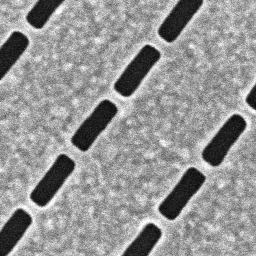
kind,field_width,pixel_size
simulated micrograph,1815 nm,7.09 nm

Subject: holes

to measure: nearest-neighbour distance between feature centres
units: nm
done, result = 488